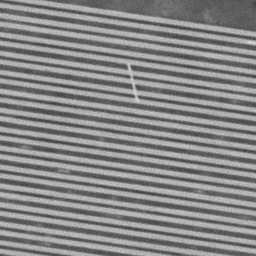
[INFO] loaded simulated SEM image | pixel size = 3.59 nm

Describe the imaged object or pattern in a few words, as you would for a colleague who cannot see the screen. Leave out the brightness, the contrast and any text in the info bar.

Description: parallel lines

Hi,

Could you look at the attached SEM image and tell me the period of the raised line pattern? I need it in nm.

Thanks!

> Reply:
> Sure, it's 33.6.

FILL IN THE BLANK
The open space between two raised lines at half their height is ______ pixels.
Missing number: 4.57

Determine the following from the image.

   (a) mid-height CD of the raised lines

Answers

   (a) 0.0133 µm